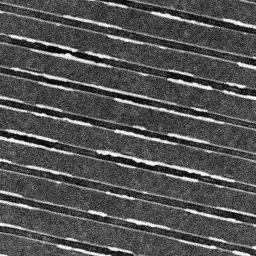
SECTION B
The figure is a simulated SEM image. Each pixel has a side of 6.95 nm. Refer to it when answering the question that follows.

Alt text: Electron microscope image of parallel lines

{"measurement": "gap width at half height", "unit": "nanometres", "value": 46.7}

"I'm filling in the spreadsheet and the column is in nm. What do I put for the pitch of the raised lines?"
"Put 214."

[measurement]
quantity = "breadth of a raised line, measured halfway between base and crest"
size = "167 nm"